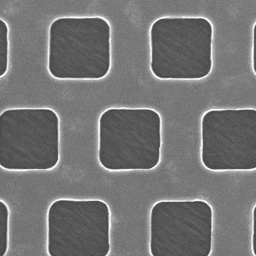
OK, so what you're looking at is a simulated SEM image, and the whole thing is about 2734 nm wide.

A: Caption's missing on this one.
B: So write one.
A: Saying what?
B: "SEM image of holes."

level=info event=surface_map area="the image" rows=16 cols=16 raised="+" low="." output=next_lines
++++++++++++++++
+++....+++...+++
+++....++....+++
+++....++....+++
+++....+++...+++
++++++++++++++++
++++++++++++++++
....++....+++...
....++....+++...
....++....+++...
...++++..++++...
++++++++++++++++
++++++++++++++++
.++....++....+++
+++....++....+++
+++....++....+++